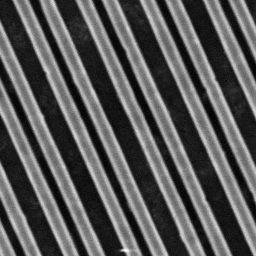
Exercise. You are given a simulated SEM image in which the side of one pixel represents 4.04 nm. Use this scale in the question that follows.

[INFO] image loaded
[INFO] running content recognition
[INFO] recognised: parallel lines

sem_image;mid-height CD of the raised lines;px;11.4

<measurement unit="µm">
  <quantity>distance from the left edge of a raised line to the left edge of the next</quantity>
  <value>0.117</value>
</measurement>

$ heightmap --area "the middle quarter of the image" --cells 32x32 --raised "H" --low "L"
LHHHLLLLLLLHHHLLLHHHLLLLLLLHHHLL
LLHHHLLLLLLHHHLLLLHHHLLLLLLHHHLL
LLHHHLLLLLLLHHHLLLHHHLLLLLLLHHHL
LLLHHHLLLLLLHHHLLLLHHHLLLLLLHHHL
LLLHHHLLLLLLLHHHLLLHHHLLLLLLHHHL
LLLLHHLLLLLLLHHHLLLHHHLLLLLLLHHH
HLLLHHHLLLLLLLHHHLLLHHHLLLLLLHHH
HLLLLHHHLLLLLLHHHLLLHHHLLLLLLLHH
HLLLLHHHLLLLLLHHHLLLLHHHLLLLLLHH
HHLLLHHHLLLLLLLHHHLLLHHHLLLLLLLH
HHHLLLHHHLLLLLLHHHLLLLHHHLLLLLLH
HHHLLLHHHLLLLLLLHHHLLLHHHLLLLLLL
HHHHLLLHHHLLLLLLHHHLLLLHHHLLLLLL
LHHHLLLHHHLLLLLLLHHHLLLHHHLLLLLL
LHHHLLLLHHHLLLLLLHHHLLLLHHLLLLLL
LLHHHLLLHHHLLLLLLLHHHLLLHHHLLLLL
LLHHHLLLLHHHLLLLLLHHHLLLHHHHLLLL
LLLHHHLLLHHHLLLLLLHHHLLLLHHHLLLL
LLLHHHLLLHHHHLLLLLLHHHLLLHHHLLLL
LLLLHHLLLLHHHLLLLLLHHHLLLLHHHLLL
LLLLHHHLLLHHHLLLLLLLHHHLLLHHHLLL
LLLLHHHLLLLHHHLLLLLLHHHLLLLHHHLL
LLLLLHHHLLLHHHLLLLLLLHHHLLLHHHLL
LLLLLHHHLLLLHHHLLLLLLHHHLLLLHHLL
LLLLLLHHHLLLHHHLLLLLLLHHHLLLHHHL
LLLLLLHHHLLLLHHHLLLLLLHHHLLLLHHL
LLLLLLLHHHLLLHHHLLLLLLHHHLLLLHHH
HLLLLLLHHHLLLHHHHLLLLLLHHHLLLHHH
HLLLLLLLHHLLLLHHHLLLLLLHHHLLLLHH
HHLLLLLLHHHLLLHHHLLLLLLLHHHLLLHH
HHLLLLLLLHHLLLLHHHLLLLLLHHHLLLLH
HHHLLLLLLHHHLLLHHHLLLLLLLHHHLLLH